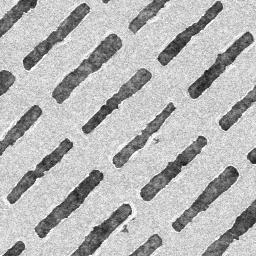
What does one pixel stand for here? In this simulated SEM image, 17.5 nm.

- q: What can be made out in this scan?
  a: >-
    a regular array of holes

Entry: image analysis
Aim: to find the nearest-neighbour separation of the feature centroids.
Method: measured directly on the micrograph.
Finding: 776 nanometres